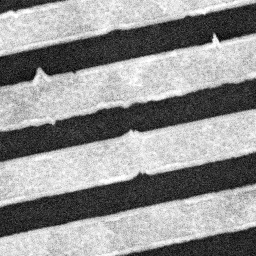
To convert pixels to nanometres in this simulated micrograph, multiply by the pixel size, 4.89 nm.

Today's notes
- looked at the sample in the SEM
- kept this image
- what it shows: one or a few lines or trenches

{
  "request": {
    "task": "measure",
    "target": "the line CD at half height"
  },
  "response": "186 nm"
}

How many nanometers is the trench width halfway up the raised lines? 170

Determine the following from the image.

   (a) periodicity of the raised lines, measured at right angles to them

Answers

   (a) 359 nm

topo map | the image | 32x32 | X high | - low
-------XXXXXXXXXXXXXXXXXXXXXXX--
---XXXXXXXXXXXXXXXXXXXXXXX------
XXXXXXXXXXXXXXXXXXXX------------
XXXXXXXXXXXXXX------------------
XXXXXXXXXXX---------------------
XXXXX---------------------XXXXXX
X---------------------XXXXXXXXXX
------------------XXXXXXXXXXXXXX
-------------XXXXXXXXXXXXXXXXXXX
----XX--XXXXXXXXXXXXXXXXXXXXXXXX
----XXXXXXXXXXXXXXXXXXXXXXX-----
XXXXXXXXXXXXXXXXXXXXXXX---------
XXXXXXXXXXXXXXXXX---------------
XXXXXXXXXXXX--------------------
XXXXXXXX---------------------XXX
XXXX---------------------XXXXXXX
--------------------XXXXXXXXXXXX
---------------XXXXXXXXXXXXXXXXX
----------XXXXXXXXXXXXXXXXXXXXXX
-----XXXXXXXXXXXXXXXXXXXXXXX----
-XXXXXXXXXXXXXXXXXXXXXXX--------
XXXXXXXXXXXXXXXXX---------------
XXXXXXXXXXXXXXX-----------------
XXXXXXXXXX---------------------X
XXXXX---------------------XXXXXX
---------------------XXXXXXXXXXX
----------------XXXXXXXXXXXXXXXX
------------XXXXXXXXXXXXXXXXXXXX
-------XXXXXXXXXXXXXXXXXXXXXXX--
---XXXXXXXXXXXXXXXXXXXXXX-------
XXXXXXXXXXXXXXXXXXXX------------
XXXXXXXXXXXXXXXX----------------